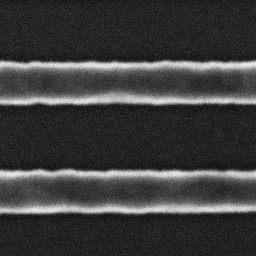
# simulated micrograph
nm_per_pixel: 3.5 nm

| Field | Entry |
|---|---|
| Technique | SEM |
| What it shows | lines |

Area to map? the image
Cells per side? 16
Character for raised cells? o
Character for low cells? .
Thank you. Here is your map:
................
................
................
................
oooooooooooooooo
oooooooooooooooo
................
................
................
................
................
oooooooooooooooo
oooooooooooooooo
................
................
................